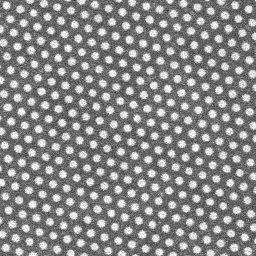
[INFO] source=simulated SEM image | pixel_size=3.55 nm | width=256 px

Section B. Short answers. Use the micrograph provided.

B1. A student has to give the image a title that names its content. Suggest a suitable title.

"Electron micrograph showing a regular array of raised bodies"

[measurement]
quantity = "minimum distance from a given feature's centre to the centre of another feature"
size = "49.1 nanometres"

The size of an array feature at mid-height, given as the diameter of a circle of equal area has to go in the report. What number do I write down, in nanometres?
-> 25.6